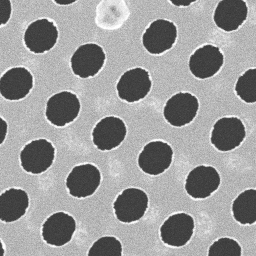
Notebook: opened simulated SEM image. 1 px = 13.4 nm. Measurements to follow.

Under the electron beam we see a regular array of holes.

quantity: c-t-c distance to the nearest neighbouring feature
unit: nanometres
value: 705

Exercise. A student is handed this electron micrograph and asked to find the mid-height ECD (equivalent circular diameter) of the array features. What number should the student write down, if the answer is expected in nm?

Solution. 454